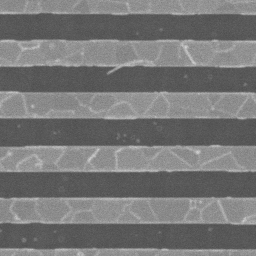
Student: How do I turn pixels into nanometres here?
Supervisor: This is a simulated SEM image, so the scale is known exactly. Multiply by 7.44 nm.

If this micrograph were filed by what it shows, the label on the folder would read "lines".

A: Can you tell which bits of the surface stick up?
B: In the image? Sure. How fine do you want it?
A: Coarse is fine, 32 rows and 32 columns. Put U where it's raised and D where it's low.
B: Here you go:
UUUUUUUUUUUUUUUUUUUUUUUUUUUUUUUU
UUUUUUUUUUUUUUUUUUUUUUUUUUUUUUUU
DDDDDDDDDDDDDDDDDDDDDDDDDDDDDDDD
DDDDDDDDDDDDDDDDDDDDDDDDDDDDDDDD
DDDDDDDDDDDDDDDDDDDDDDDDDDDDDDDD
UUUUUUUUUUUUUUUUUUUUUUUUUUUUUUUU
UUUUUUUUUUUUUUUUUUUUUUUUUUUUUUUU
UUUUUUUUUUUUUUUUUUUUUUUUUUUUUUUU
DDDDDDDDDDDDDDDDDDDDDDDDDDDDDDDD
DDDDDDDDDDDDDDDDDDDDDDDDDDDDDDDD
DDDDDDDDDDDDDDDDDDDDDDDDDDDDDDDD
DDDDDDDDDDDDDDDDDDDDDDDDDDDDDDDD
UUUUUUUUUUUUUUUUUUUUUUUUUUUUUUUU
UUUUUUUUUUUUUUUUUUUUUUUUUUUUUUUU
UUUUUUUUUUUUUUUUUUUUUUUUUUUUUUUU
DDDDDDDDDDDDDDDDDDDDDDDDDDDDDDDD
DDDDDDDDDDDDDDDDDDDDDDDDDDDDDDDD
DDDDDDDDDDDDDDDDDDDDDDDDDDDDDDDD
UUUUUUUUUUUUUUUUUUUUUUUUUUUUUUUU
UUUUUUUUUUUUUUUUUUUUUUUUUUUUUUUU
UUUUUUUUUUUUUUUUUUUUUUUUUUUUUUUU
DDDDDDDDDDDDDDDDDDDDDDDDDDDDDDDD
DDDDDDDDDDDDDDDDDDDDDDDDDDDDDDDD
DDDDDDDDDDDDDDDDDDDDDDDDDDDDDDDD
DDDDDDDDDDDDDDDDDDDDDDDDDDDDDDDD
UUUUUUUUUUUUUUUUUUUUUUUUUUUUUUUU
UUUUUUUUUUUUUUUUUUUUUUUUUUUUUUUU
UUUUUUUUUUUUUUUUUUUUUUUUUUUUUUUU
DDDDDDDDDDDDDDDDDDDDDDDDDDDDDDDD
DDDDDDDDDDDDDDDDDDDDDDDDDDDDDDDD
DDDDDDDDDDDDDDDDDDDDDDDDDDDDDDDD
UUUUUUUUUUUUUUUUUUUUUUUUUUUUUUUU